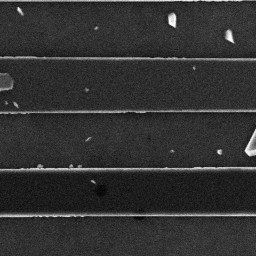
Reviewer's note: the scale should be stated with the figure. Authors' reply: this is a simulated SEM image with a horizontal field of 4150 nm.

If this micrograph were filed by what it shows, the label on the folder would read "lines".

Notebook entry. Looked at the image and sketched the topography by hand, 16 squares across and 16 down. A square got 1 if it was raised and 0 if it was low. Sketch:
0000000000000000
0000000000000000
0000000000000000
0000000000000000
1111111111111111
1111111111111111
1111111111111111
0000000000000000
0000000000000000
0000000000000000
0000000000101111
1111111111111111
1111111111111111
1111110000000000
0000000000000000
0000000000000000